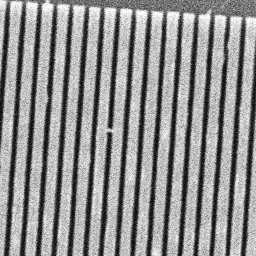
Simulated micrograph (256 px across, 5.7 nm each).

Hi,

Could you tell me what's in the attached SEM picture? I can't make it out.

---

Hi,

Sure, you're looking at parallel lines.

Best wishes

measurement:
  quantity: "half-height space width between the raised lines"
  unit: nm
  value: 28.4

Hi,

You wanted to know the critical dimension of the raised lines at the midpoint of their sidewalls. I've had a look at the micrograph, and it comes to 62.5 nm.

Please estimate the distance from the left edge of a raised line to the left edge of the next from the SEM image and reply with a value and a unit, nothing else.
89.6 nm